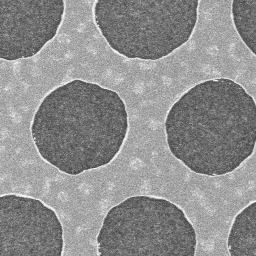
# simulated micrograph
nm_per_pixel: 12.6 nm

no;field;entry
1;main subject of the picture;holes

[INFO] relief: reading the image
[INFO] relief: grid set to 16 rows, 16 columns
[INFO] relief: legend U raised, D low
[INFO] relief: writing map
DDDDUUDDDDDDUUUD
DDDDUUDDDDDDUUUD
DDDUUUUDDDDDUUUD
DDUUUUUUDDUUUUUU
UUUUUUUUUUUUUUUU
UUUUDDDUUUUUDDDU
UUUDDDDDUUUDDDDD
UUDDDDDDUUDDDDDD
UUDDDDDDUUDDDDDD
UUDDDDDUUUUDDDDD
UUUUDDUUUUUUDDDU
UUUUUUUUUUUUUUUU
DDUUUUUUDDUUUUUU
DDDDUUUDDDDDUUUD
DDDDUUDDDDDDUUDD
DDDDUUDDDDDDUUDD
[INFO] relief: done